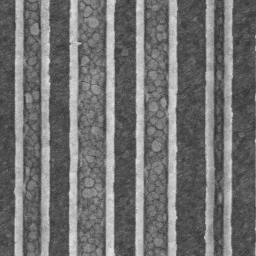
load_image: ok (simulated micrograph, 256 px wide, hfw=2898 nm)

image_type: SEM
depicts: one or a few lines or trenches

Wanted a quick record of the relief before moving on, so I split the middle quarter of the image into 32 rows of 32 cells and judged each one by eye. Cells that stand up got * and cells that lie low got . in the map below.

**..........*******........*****
**..........*******........*****
**..........*******........*****
**..........*******........*****
**..........*******........*****
**..........*******........*****
**..........*******........*****
**..........*******........*****
**..........*******........*****
**..........*******........*****
**..........*******........*****
**..........*******........*****
**..........*******........*****
**..........*******........*****
**..........*******........*****
**..........*******........*****
**..........*******........*****
**..........*******........*****
**..........*******........*****
**..........*******........*****
**..........*******........*****
**..........*******........*****
**..........*******........*****
**..........*******........*****
**..........*******........*****
**..........*******........*****
**..........*******........*****
**..........*******........*****
**..........*******........*****
**..........*******........*****
**..........*******........*****
**..........*******........*****